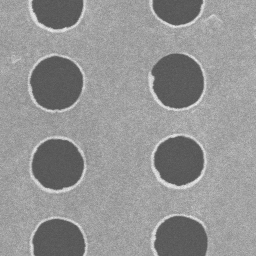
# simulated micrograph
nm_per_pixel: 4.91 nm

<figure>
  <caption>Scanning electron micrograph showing holes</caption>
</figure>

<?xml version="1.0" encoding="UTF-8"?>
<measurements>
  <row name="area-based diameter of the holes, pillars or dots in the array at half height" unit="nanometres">257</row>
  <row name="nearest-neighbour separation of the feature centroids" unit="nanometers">396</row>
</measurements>